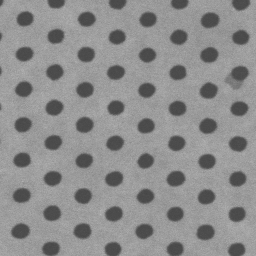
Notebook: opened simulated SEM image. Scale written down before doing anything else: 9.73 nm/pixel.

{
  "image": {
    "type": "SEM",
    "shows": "a regular array of holes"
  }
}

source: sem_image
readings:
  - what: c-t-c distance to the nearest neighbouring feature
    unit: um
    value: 0.342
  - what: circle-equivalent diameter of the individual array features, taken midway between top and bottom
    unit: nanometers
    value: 159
